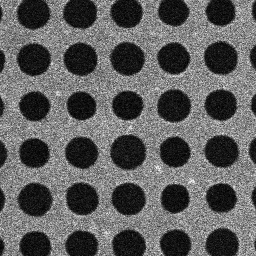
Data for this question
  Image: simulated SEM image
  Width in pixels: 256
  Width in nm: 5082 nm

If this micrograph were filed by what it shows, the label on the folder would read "a regular array of holes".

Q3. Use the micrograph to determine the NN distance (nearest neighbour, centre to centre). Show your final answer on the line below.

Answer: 920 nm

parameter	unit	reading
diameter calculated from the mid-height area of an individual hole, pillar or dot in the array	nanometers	667